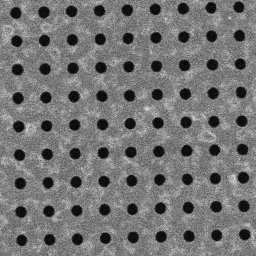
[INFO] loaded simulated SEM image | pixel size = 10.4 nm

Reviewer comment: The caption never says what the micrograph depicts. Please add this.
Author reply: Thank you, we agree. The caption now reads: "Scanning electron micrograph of a regular array of holes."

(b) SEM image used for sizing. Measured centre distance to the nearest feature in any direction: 0.29 µm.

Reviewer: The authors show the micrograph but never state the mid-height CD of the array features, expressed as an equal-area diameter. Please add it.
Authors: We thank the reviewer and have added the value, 0.124 micrometres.